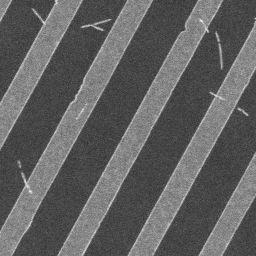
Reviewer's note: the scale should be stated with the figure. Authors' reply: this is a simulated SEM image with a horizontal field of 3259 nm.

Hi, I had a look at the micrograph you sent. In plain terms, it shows one or a few lines or trenches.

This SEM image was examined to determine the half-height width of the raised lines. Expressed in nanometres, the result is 272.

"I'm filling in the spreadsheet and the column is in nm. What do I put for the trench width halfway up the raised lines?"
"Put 510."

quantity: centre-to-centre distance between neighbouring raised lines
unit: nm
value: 785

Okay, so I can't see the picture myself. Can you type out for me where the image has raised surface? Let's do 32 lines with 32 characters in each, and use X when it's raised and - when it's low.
X------XXX------XXX------XXX----
X-----XXXX-----XXX------XXX-----
------XXX------XXX-----XXX------
-----XXX------XXX------XXX------
-----XXX-----XXXX-----XXX------X
----XXX------XXX------XXX------X
----XXX-----XXXX-----XXX------XX
---XXX------XXX------XXX-----XXX
--XXXX-----XXX------XXX------XXX
--XXX------XXX------XXX-----XXX-
-XXXX-----XXX------XXX------XXX-
-XXX------XXX-----XXX------XXX--
XXX------XXX------XXX------XXX--
XXX------XXX-----XXX------XXX---
XX------XXX------XXX------XXX---
XX-----XXXX-----XXX------XXX----
X------XXX------XXX------XXX----
X-----XXX------XXX------XXX-----
------XXX------XXX-----XXXX-----
-----XXX------XXX------XXX------
-----XXX-----XXXX-----XXX------X
----XXX------XXX------XXX------X
---XXXX-----XXX------XXX------XX
---XXX------XXX------XXX------XX
--XXXX-----XXX------XXX------XXX
--XXX------XXX-----XXXX-----XXX-
-XXX------XXX------XXX------XXX-
-XXX------XXX-----XXXX-----XXX--
XXXX-----XXX------XXX------XXX--
XXX------XXX-----XXX------XXX---
XX------XXX------XXX------XXX---
XX------XXX-----XXX------XXX----